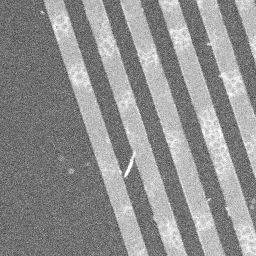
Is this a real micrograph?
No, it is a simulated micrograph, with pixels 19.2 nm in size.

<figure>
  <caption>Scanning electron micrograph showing parallel lines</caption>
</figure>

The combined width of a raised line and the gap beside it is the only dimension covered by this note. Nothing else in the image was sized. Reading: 698 nm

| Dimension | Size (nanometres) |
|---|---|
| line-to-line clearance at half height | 346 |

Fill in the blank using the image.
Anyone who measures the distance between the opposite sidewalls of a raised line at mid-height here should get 346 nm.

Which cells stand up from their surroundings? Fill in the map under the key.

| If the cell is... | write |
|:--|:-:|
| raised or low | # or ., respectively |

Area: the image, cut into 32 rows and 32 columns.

......##..###..###..##...##...##
......##...##...##..###..##...##
......###..##...##...##..###..##
.......##..###..###..##...##...#
.......##...##...##..###..##...#
.......###..##...##...##..###..#
........##..###..###..##...##...
........##...##...##..###..##...
........###..##...##...##..###..
.........##..###..###..##...##..
.........##...##...##..###..##..
.........###..##...##...##..###.
..........##..###..###..##...##.
..........##...##...##..###..##.
..........###..##...##...##..###
...........##..###..###..##...##
...........##...##...##..###..##
...........###..##...##...##..##
............##..###..###..##...#
............##...##...##..###..#
............###..##...##...##..#
.............##..###..###..##...
.............##...##...##..###..
.............###..##...##...##..
..............##..###..###..##..
..............##...##..###..###.
..............###..##...##...##.
...............##..###..###..##.
...............##...##...##..###
...............###..##...##...##
................##..###..###..##
................##...##...##..##